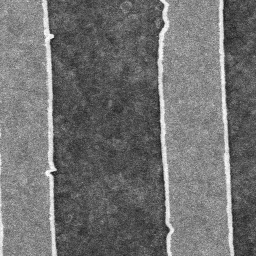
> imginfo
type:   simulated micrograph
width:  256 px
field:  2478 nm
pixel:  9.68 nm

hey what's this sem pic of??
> one or a few lines or trenches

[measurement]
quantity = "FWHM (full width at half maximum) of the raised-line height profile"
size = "604 nanometers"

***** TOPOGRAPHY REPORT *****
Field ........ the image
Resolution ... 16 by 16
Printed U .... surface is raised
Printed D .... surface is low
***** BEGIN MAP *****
UUUDDDDDDDUUUUDD
UUUDDDDDDDUUUUDD
UUUDDDDDDDUUUUDD
UUUDDDDDDDUUUUDD
UUUDDDDDDDUUUUDD
UUUDDDDDDDUUUUDD
UUUDDDDDDDUUUUDD
UUUDDDDDDDUUUUDD
UUUDDDDDDDUUUUDD
UUUDDDDDDDUUUUDD
UUUDDDDDDDUUUUDD
UUUDDDDDDDUUUUDD
UUUDDDDDDDUUUUDD
UUUDDDDDDDUUUUDD
UUUDDDDDDDDUUUDD
UUUDDDDDDDDUUUDD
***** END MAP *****